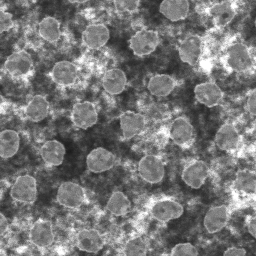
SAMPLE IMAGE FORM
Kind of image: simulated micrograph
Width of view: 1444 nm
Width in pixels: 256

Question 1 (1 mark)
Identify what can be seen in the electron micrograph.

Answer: a regular array of raised bodies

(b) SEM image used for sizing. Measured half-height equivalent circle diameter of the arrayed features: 142 nm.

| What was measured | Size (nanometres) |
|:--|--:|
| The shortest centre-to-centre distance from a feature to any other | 260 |